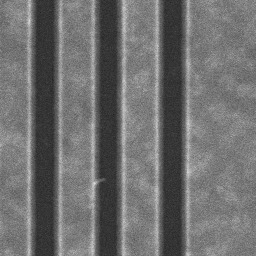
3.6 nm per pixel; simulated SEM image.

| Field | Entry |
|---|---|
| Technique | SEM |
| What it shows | one or a few lines or trenches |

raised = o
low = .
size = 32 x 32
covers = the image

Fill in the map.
oooo...ooooo...ooooo...ooooooooo
oooo...ooooo...ooooo...ooooooooo
oooo...ooooo...ooooo...ooooooooo
oooo...ooooo...ooooo...ooooooooo
oooo...ooooo...ooooo...ooooooooo
oooo...ooooo...ooooo...ooooooooo
oooo...ooooo...ooooo...ooooooooo
oooo...ooooo...ooooo...ooooooooo
oooo...ooooo...ooooo...ooooooooo
oooo...ooooo...ooooo...ooooooooo
oooo...ooooo...ooooo...ooooooooo
oooo...ooooo...ooooo...ooooooooo
oooo...ooooo...ooooo...ooooooooo
oooo...ooooo...ooooo...ooooooooo
oooo...ooooo...ooooo...ooooooooo
oooo...ooooo...ooooo...ooooooooo
oooo...ooooo...ooooo...ooooooooo
oooo...ooooo...ooooo...ooooooooo
oooo...ooooo...ooooo...ooooooooo
oooo...ooooo...ooooo...ooooooooo
oooo...ooooo...ooooo...ooooooooo
oooo...ooooo...ooooo...ooooooooo
oooo...ooooo...ooooo...ooooooooo
oooo...ooooo...ooooo...ooooooooo
oooo...ooooo...ooooo...ooooooooo
oooo...ooooo...ooooo...ooooooooo
oooo...ooooo...ooooo...ooooooooo
oooo...ooooo...ooooo...ooooooooo
oooo...ooooo...ooooo...ooooooooo
oooo...ooooo...ooooo...ooooooooo
oooo...ooooo...ooooo...ooooooooo
oooo...ooooo...ooooo...ooooooooo